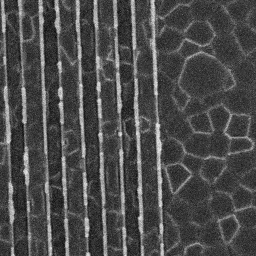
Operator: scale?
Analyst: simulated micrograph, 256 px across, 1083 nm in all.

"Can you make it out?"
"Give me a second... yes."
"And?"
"parallel lines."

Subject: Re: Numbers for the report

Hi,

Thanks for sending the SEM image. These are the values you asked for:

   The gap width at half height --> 60.2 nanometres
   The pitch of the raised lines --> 0.159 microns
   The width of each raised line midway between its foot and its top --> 97.6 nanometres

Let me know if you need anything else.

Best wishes